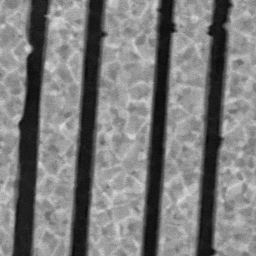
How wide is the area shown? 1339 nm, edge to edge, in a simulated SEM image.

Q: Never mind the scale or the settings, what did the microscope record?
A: one or a few lines or trenches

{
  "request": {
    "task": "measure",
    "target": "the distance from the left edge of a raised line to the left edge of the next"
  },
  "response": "328 nm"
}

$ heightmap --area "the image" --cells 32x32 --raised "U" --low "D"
UUUUDDUUUUUDDUUUUUUUDDUUUUUDDUUU
UUUUDDUUUUUDDUUUUUUUDDUUUUUDDUUU
UUUDDDUUUUUDDUUUUUUUDDUUUUDDDUUU
UUUDDDUUUUUDDUUUUUUUDDUUUUDDUUUU
UUUDDDUUUUUDDUUUUUUUDDUUUUDDDUUU
UUUUDDUUUUUDDUUUUUUUDUUUUUDDDUUU
UUUUDDUUUUDDDUUUUUUDDUUUUUDDUUUU
UUUDDDUUUUDDDUUUUUUDDUUUUUDDUUUU
UUUDDUUUUUDDDUUUUUUDDUUUUUDDUUUU
UUUDDUUUUUDDUUUUUUUDDUUUUUDDUUUU
UUUDDUUUUUDDUUUUUUUDDUUUUUDDUUUU
UUUDDUUUUUDDUUUUUUUDDUUUUUDDUUUU
UUUDDUUUUUDDUUUUUUUDDUUUUUDDUUUU
UUUDDUUUUUDDUUUUUUUDDUUUUUDDUUUU
UUUDDUUUUUDDUUUUUUUDDUUUUUDDUUUU
UUDDDUUUUUDDUUUUUUUDDUUUUUDDUUUU
UUDDDUUUUUDDUUUUUUUDDUUUUDDDUUUU
UUDDDUUUUUDDUUUUUUUDDUUUUDDDUUUU
UUDDDUUUUUDDUUUUUUUDDUUUUDDDUUUU
UUDDDUUUUUDDUUUUUUUDDUUUUDDUUUUU
UUDDDUUUUDDDUUUUUUDDDUUUUDDUUUUU
UUDDDUUUUDDDUUUUUUDDDUUUUDDUUUUU
UUDDDUUUUDDDUUUUUUDDUUUUUDDUUUUU
UUDDDUUUUDDUUUUUUUDDUUUUUDDUUUUU
UUDDDUUUUDDUUUUUUUDDUUUUUDDUUUUU
UUDDUUUUUDDUUUUUUUDDUUUUUDDUUUUU
UUDDUUUUUDDUUUUUUUDDUUUUUDDUUUUU
UUDDUUUUUDDUUUUUUUDDUUUUUDDUUUUU
UUDDUUUUUDDUUUUUUUDDUUUUUDDUUUUU
UUDDUUUUUDDUUUUUUUDDUUUUUDDUUUUU
UUDDUUUUUDDUUUUUUUDDUUUUUDDUUUUU
UUDDUUUUUDDUUUUUUUDDUUUUUDDUUUUU